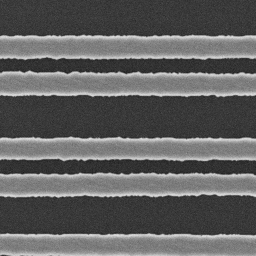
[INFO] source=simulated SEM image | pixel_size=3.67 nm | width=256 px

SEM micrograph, lines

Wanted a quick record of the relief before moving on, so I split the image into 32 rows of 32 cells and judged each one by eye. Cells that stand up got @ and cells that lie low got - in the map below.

--------------------------------
--------------------------------
--------------------------------
--------------------------------
@@@@@@@@@@@@@@@@@@-@@@@@@@@@@@@@
@@@@@@@@@@@@@@@@@@@@@@@@@@@@@@@@
@@@@@@@@@@@@@@@@@@@@@@@@@@@@@@@@
--------------------------------
--------------------------------
@@@@@@@@@@@@@@@@@@@@@@@@@@@@@@@@
@@@@@@@@@@@@@@@@@@@@@@@@@@@@@@@@
@@@@@@@@@@@@@@@@@@@@@@@@@@@@@@@@
--------------------------------
--------------------------------
--------------------------------
--------------------------------
--------------------------------
@@@@@@@@@@@@@@@@@@@@@@@@@@@@@@@@
@@@@@@@@@@@@@@@@@@@@@@@@@@@@@@@@
@@@@@@@@@@@@@@@@@@@@@@@@@@@@@@@@
--------------------------------
--------------------------------
@@@@@@@@@@@@@@@@@@@@@@@@@@@@@@@@
@@@@@@@@@@@@@@@@@@@@@@@@@@@@@@@@
@@@@@@@@@@-@@@@----@------------
--------------------------------
--------------------------------
--------------------------------
--------------------------------
@@@@@@@@@@@@@@@@@@@@@@@@@@@@@@@@
@@@@@@@@@@@@@@@@@@@@@@@@@@@@@@@@
@@@@@@@@@@@@@@@@@@@@@@@@@@@@@@@@